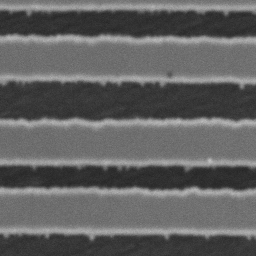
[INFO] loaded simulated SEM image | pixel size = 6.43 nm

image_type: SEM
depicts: lines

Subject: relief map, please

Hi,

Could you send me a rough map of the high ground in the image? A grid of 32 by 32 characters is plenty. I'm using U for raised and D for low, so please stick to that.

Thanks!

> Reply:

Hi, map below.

UUUUUUUUUUUUUUUUUUUUUUUUUUUUUUUU
DDDDDDDDDDDDDDDDDDDDDDDDDDDDDDDD
DDDDDDDDDDDDDDDDDDDDDDDDDDDDDDDD
DDDDDDDDDDDDDDDDDDDDDDDDDDDDDDDD
UUUUUDDUUUDDUUUDDDDDDDDDDDDDDDDD
UUUUUUUUUUUUUUUUUUUUUUUUUUUUUUUU
UUUUUUUUUUUUUUUUUUUUUUUUUUUUUUUU
UUUUUUUUUUUUUUUUUUUUUUUUUUUUUUUU
UUUUUUUUUUUUUUUUUUUUUUUUUUUUUUUU
UUUUUUUUUUUUUUUUUUUUUUUUUUUUUUUU
DDDDDDDDDDDDDDDDDDDDDDDDDDDDDDDD
DDDDDDDDDDDDDDDDDDDDDDDDDDDDDDDD
DDDDDDDDDDDDDDDDDDDDDDDDDDDDDDDD
DDDDDDDDDDDDDDDDDDDDDDDDDDDDDDDD
DDDDDDDDDDDDDDDDDDDDDDDDDDDDDDDD
UUUUUUUUUUUUUUUUUUUUUUUUUUUUUUUU
UUUUUUUUUUUUUUUUUUUUUUUUUUUUUUUU
UUUUUUUUUUUUUUUUUUUUUUUUUUUUUUUU
UUUUUUUUUUUUUUUUUUUUUUUUUUUUUUUU
UUUUUUUUUUUUUUUUUUUUUUUUUUUUUUUU
UUUUUUUUUUUUUUUUUUUUUUUUUUUUUUUU
DDDDDDDDDDDDDDDDDDDDDDDDDDDDDDDD
DDDDDDDDDDDDDDDDDDDDDDDDDDDDDDDD
UDDUUUUUUUUUUDDDUUDDDDDDUDDDDDDD
UUUUUUUUUUUUUUUUUUUUUUUUUUUUUUUU
UUUUUUUUUUUUUUUUUUUUUUUUUUUUUUUU
UUUUUUUUUUUUUUUUUUUUUUUUUUUUUUUU
UUUUUUUUUUUUUUUUUUUUUUUUUUUUUUUU
UUUUUUUUUUUUUUUUUUUUUUUUUUUUUUUU
DDDDDDDDDDDDDDDDDDDDDDDDDDDDDDDD
DDDDDDDDDDDDDDDDDDDDDDDDDDDDDDDD
DDDDDDDDDDDDDDDDDDDDDDDDDDDDDDDD